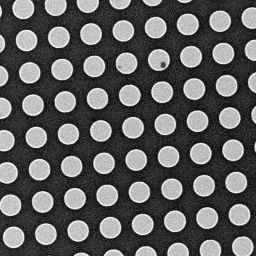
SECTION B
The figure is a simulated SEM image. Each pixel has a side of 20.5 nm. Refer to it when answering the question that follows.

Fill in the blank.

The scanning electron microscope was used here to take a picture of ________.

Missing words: an array of small figures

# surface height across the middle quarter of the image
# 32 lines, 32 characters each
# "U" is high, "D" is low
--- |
UUDDDUUUUUDDDUUUUUDDDDUUUUDDDDDU
UUDDDUUUUUDDDDUUUUDDDDDUUDDDDDDD
UUDDDDUUUDDDDDDDDDDDDDDDDDDDDDDD
UDDDDDDDDDDDDDDDDDDDDDDDDDDDDDDD
DDDDDDDDDDDDDDDDDDDDDDDDDDDDDDDU
DDDDDDDDDDDDDDDUUDDDDDUUUUUDDDUU
DDDDDDDUUUDDDDUUUUUDDDUUUUUDDDUU
UUDDDDUUUUUDDDUUUUUDDDUUUUUDDDUU
UUUDDDUUUUUDDDUUUUUDDDUUUUUDDDDU
UUUDDDUUUUUDDDDUUUDDDDDDUDDDDDDD
UUUDDDDUUUDDDDDDDDDDDDDDDDDDDDDD
UUDDDDDDDDDDDDDDDDDDDDDDDDDDDDDD
DDDDDDDDDDDDDDDDDDDDDDDDDDDDDDDD
DDDDDDDDDDDDDDDDUUDDDDDUUUUDDDDU
DDDDDDDDUUDDDDDUUUUDDDDUUUUUDDDU
UUUDDDDUUUUUDDDUUUUUDDDUUUUUDDDU
UUUDDDDUUUUUDDDUUUUUDDDUUUUUDDDD
UUUUDDDUUUUUDDDUUUUDDDDDDUDDDDDD
UUUDDDDUUUUDDDDDDUDDDDDDDDDDDDDD
UUUDDDDDDDDDDDDDDDDDDDDDDDDDDDDD
DDDDDDDDDDDDDDDDDDDDDDDDDDDDDDDD
DDDDDDDDDDDDDDDDDUUDDDDDUUUUDDDD
DDDDDDDDDUUDDDDDUUUUDDDDUUUUUDDD
UUUDDDDDUUUUDDDDUUUUUDDDUUUUUDDD
UUUUDDDUUUUUUDDDUUUUUDDDUUUUDDDD
UUUUDDDDUUUUDDDDUUUUDDDDDUUDDDDD
UUUUDDDDUUUUDDDDDUUDDDDDDDDDDDDD
UUUUDDDDDDDDDDDDDDDDDDDDDDDDDDDD
DDDDDDDDDDDDDDDDDDDDDDDDDDDDDDDD
DDDDDDDDDDDDDDDDDDDDDDDDDUUUUDDD
DDDDDDDDDDUUDDDDDUUUUDDDUUUUUDDD
DUUUDDDDDUUUUDDDUUUUUDDDDUUUUDDD